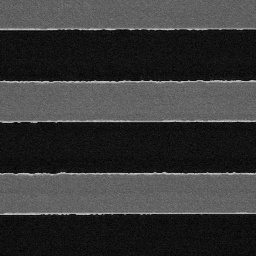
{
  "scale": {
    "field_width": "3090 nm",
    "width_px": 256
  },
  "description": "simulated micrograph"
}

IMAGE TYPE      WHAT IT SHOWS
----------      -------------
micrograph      lines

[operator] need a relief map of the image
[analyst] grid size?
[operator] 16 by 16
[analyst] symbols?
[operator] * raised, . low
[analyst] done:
****************
****************
................
................
................
****************
****************
****************
................
................
................
****************
****************
................
................
................